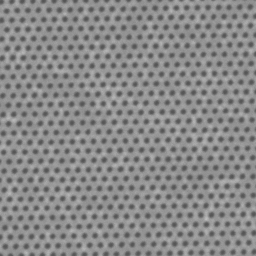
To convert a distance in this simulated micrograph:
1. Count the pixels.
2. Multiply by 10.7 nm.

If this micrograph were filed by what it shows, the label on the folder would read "a regular array of holes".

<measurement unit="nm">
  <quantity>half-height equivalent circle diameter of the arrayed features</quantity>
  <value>66.1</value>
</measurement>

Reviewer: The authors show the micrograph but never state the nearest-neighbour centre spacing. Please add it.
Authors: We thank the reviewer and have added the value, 0.111 µm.